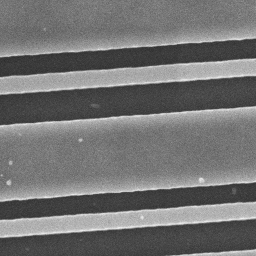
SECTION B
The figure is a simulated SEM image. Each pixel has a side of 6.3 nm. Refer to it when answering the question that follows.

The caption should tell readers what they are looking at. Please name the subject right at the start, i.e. lines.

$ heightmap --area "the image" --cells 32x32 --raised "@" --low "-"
@@@@@@@@@@@@@@@@@@@@@@@@@@@@@@@@
@@@@@@@@@@@@@@@@@@@@@@@@@@@@@@@@
@@@@@@@@@@@@@@@@@@@@@@@@@@@@@@@@
@@@@@@@@@@@@@@@@@@@@@@@@@@@@@@@@
@@@@@@@@@@@@@@@@@@@@@@@@@@@@@@@@
@@@@@@@@@@@@@@@@@@@@@@----------
@@@@@@@@------------------------
-------------------------------@
-----------------@@@@@@@@@@@@@@@
--@@@@@@@@@@@@@@@@@@@@@@@@@@@@--
@@@@@@@@@@@@@@@@@---------------
@@@@----------------------------
--------------------------------
-------------------------------@
-----------------@@@@@@@@@@@@@@@
---@@@@@@@@@@@@@@@@@@@@@@@@@@@@@
@@@@@@@@@@@@@@@@@@@@@@@@@@@@@@@@
@@@@@@@@@@@@@@@@@@@@@@@@@@@@@@@@
@@@@@@@@@@@@@@@@@@@@@@@@@@@@@@@@
@@@@@@@@@@@@@@@@@@@@@@@@@@@@@@@@
@@@@@@@@@@@@@@@@@@@@@@@@@@@@@@@@
@@@@@@@@@@@@@@@@@@@@@@@@@@@@@@@@
@@@@@@@@@@@@@@@@@@@@@@@@@@@@@@@@
@@@@@@@@@@@@@@@@@@@@@@----------
@@@@@@@@------------------------
-----------------------------@@@
---------------@@@@@@@@@@@@@@@@@
@@@@@@@@@@@@@@@@@@@@@@@@@@@@----
@@@@@@@@@@@@@@@@----------------
@@------------------------------
--------------------------------
-----------------------------@@@